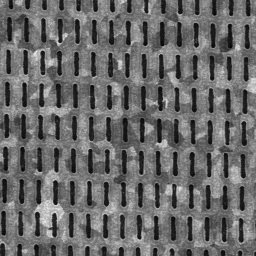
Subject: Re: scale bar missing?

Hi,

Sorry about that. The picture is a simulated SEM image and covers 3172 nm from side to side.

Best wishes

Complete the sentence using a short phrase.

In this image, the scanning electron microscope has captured a regular array of holes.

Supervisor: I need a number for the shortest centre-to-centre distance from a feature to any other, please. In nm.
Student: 210